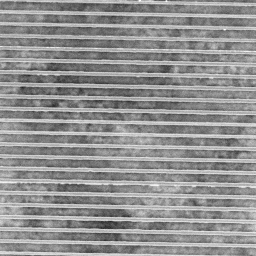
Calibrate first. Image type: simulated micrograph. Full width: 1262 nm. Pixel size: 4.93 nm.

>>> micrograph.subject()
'parallel lines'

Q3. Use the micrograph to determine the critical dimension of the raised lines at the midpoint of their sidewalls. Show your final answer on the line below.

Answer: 18.5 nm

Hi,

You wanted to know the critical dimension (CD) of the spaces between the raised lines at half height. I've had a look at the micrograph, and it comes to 41.3 nm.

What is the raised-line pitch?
59.5 nanometres